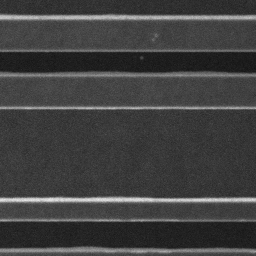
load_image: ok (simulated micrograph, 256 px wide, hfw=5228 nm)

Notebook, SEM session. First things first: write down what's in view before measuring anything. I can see lines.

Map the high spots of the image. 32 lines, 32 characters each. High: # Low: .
................................
................................
################################
################################
################################
################################
................................
................................
................................
################################
################################
################################
################################
................................
................................
................................
................................
................................
................................
................................
................................
................................
................................
................................
................................
################################
################################
################################
................................
................................
................................
################################